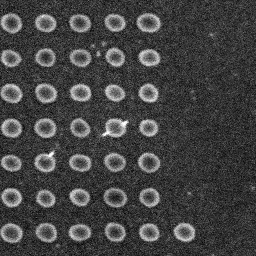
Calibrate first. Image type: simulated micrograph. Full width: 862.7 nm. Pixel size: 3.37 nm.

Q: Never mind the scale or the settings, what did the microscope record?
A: a regular array of raised bodies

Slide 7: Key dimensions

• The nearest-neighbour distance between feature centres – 115 nm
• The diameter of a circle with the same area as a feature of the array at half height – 62.9 nm